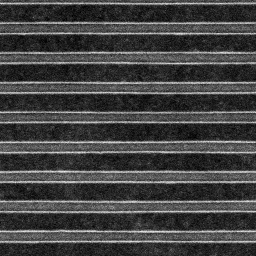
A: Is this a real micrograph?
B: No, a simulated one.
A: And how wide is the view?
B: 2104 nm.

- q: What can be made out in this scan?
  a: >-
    parallel lines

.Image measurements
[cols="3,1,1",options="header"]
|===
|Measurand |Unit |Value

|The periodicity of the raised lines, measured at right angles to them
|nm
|244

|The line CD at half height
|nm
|166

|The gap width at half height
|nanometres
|76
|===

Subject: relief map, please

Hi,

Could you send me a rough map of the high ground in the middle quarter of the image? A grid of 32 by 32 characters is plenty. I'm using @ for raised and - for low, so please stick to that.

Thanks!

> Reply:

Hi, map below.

@@@@@@@@@@@@@@@@@@@@@@@@@@@@@@@@
@@@@@@@@@@@@@@@@@@@@@@@@@@@@@@@@
@@@@@@@@@@@@@@@@@@@@@@@@@@@@@@@@
@@@@@@@@@@@@@@@@@@@@@@@@@@@@@@@@
@@@@@@@@@@@@@@@@@@@@@@@@@@@@@@@@
--------------------------------
--------------------------------
@@@@@@@@@@@@@@@@@@@@@@@@@@@@@@@@
@@@@@@@@@@@@@@@@@@@@@@@@@@@@@@@@
@@@@@@@@@@@@@@@@@@@@@@@@@@@@@@@@
@@@@@@@@@@@@@@@@@@@@@@@@@@@@@@@@
@@@@@@@@@@@@@@@@@@@@@@@@@@@@@@@@
--------------------------------
--------------------------------
--------------------------------
@@@@@@@@@@@@@@@@@@@@@@@@@@@@@@@@
@@@@@@@@@@@@@@@@@@@@@@@@@@@@@@@@
@@@@@@@@@@@@@@@@@@@@@@@@@@@@@@@@
@@@@@@@@@@@@@@@@@@@@@@@@@@@@@@@@
-----------@@@@-----------------
--------------------------------
--------------------------------
@@@@@@@@@@@@@@@@@@@@@@@@@@@@@@@@
@@@@@@@@@@@@@@@@@@@@@@@@@@@@@@@@
@@@@@@@@@@@@@@@@@@@@@@@@@@@@@@@@
@@@@@@@@@@@@@@@@@@@@@@@@@@@@@@@@
@@@@@@@@@@@@@@@@@@@@@@@@@@@@@@@@
--------------------------------
--------------------------------
--------------------------------
@@@@@@@@@@@@@@@@@@@@@@@@@@@@@@@@
@@@@@@@@@@@@@@@@@@@@@@@@@@@@@@@@